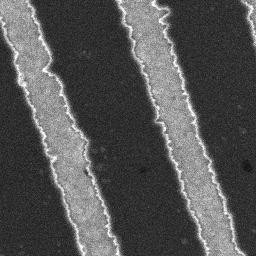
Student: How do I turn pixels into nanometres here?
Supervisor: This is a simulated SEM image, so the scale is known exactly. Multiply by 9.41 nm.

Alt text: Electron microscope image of one or a few lines or trenches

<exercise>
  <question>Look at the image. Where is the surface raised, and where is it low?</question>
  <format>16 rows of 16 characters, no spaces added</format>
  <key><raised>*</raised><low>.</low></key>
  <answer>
..******..******
..******..******
*..*****..******
*..******..*****
*..******..*****
**..*****..*****
**..******..****
**..******..****
***..*****..****
***..******..***
***...*****..***
****..*****..***
****..******..**
****...*****..**
*****..******..*
*****..******..*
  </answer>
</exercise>